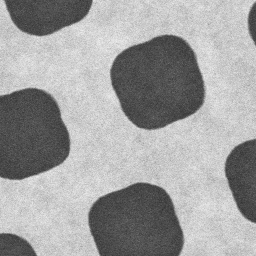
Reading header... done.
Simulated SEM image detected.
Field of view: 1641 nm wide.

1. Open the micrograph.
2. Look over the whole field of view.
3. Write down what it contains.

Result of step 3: holes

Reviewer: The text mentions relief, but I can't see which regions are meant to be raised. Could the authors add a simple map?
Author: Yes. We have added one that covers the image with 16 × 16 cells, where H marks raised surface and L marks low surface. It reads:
LLLLLLHHHHHHHHHH
HLLLLHHHHHHHHHHL
HHHHHHHHHLLLHHHH
HHHHHHHLLLLLHHHH
HHHHHHHLLLLLLHHH
HHHHHHHLLLLLLHHH
LLLLHHHHLLLLLHHH
LLLLHHHHLLLHHHHH
LLLLHHHHHHHHHHHH
LLLLHHHHHHHHHHLL
LLLHHHHHHHHHHHLL
HHHHHHHHLHHHHHLL
HHHHHHLLLLLHHHHL
HHHHHHLLLLLHHHHL
HHHHHHLLLLLHHHHH
LLHHHHLLLLLHHHHH